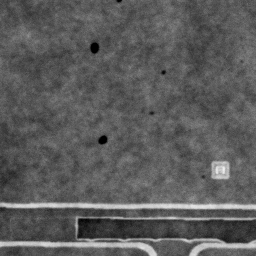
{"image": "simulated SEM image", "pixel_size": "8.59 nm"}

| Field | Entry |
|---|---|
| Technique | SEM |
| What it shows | wiring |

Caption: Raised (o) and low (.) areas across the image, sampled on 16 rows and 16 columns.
oooooooooooooooo
oooooooooooooooo
oooooooooooooooo
oooooooooooooooo
oooooooooooooooo
oooooooooooooooo
oooooooooooooooo
oooooooooooooooo
oooooooooooooooo
oooooooooooooooo
oooooooooooooooo
oooooooooooooooo
oooooooooooooooo
................
................
ooooooooo...oooo